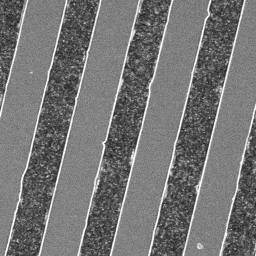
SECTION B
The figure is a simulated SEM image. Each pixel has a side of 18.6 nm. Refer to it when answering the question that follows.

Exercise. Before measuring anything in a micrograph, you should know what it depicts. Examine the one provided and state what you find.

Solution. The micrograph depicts one or a few lines or trenches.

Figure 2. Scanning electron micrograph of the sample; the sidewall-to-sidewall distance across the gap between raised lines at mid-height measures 687 nanometres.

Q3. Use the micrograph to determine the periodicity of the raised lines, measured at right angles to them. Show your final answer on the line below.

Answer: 1290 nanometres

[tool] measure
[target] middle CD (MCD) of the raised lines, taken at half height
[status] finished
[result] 0.61 um